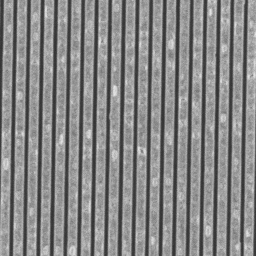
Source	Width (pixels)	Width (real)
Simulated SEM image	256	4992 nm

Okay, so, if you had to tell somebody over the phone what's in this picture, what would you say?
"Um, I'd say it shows parallel lines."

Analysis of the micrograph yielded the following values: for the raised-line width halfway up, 183 nm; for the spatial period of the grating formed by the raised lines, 264 nm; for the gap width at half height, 78 nanometres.